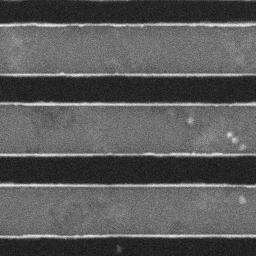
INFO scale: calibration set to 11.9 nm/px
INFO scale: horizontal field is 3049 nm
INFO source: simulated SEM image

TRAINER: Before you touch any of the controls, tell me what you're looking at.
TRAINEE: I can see lines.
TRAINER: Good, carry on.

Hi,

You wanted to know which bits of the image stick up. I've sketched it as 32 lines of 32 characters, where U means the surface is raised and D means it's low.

UUUUUUUUUUUUUUUUUUUUUUUUUUUUUUUU
UUUUUUUUUUUUUUUUUUUUUUUUUUUUUUUU
UUUUUUUUUUUUUUUUUUUUUUUUUUUUUUUU
DDDDDDDDDDDDDDDDDDDDDDDDDDDDDDDD
DDDDDDDDDDDDDDDDDDDDDDDDDDDDDDDD
DDDDDDDDDDDDDDDDDDDDDDDDDDDDDDDD
DDDDDDDDDDDDDDDDDDDDDDDDDDDDDDDD
DDDDDDDDDDDDDDDDDDDDDDDDDDDDDDDD
DDDDDDDDDDDDDDDDDDDDDDDDDDDDDDDD
UUUUUUUUUUUUUUUUUUUUUUUUUUUUUUUU
UUUUUUUUUUUUUUUUUUUUUUUUUUUUUUUU
UUUUUUUUUUUUUUUUUUUUUUUUUUUUUUUU
UUUUUUUUUUUUUUUUUUUUUUUUUUUUUUUU
DDDDDDDDDDDDDDDDDDDDDDDDDDDDDDDD
DDDDDDDDDDDDDDDDDDDDDDDDDDDDDDDD
DDDDDDDDDDDDDDDDDDDDDDDDDDDDDDDD
DDDDDDDDDDDDDDDDDDDDDDDDDDDDDDDD
DDDDDDDDDDDDDDDDDDDDDDDDDDDDDDDD
DDDDDDDDDDDDDDDDDDDDDDDDDDDDDDDD
UUUUUUUUUUUUUUUUUUUUUUUUUUUUUUUU
UUUUUUUUUUUUUUUUUUUUUUUUUUUUUUUU
UUUUUUUUUUUUUUUUUUUUUUUUUUUUUUUU
UUUUUUUUUUUUUUUUUUUUUUUUUUUUUUUU
DDDDDDDDDDDDDDDDDDDDDDDDDDDDDDDD
DDDDDDDDDDDDDDDDDDDDDDDDDDDDDDDD
DDDDDDDDDDDDDDDDDDDDDDDDDDDDDDDD
DDDDDDDDDDDDDDDDDDDDDDDDDDDDDDDD
DDDDDDDDDDDDDDDDDDDDDDDDDDDDDDDD
DDDDDDDDDDDDDDDDDDDDDDDDDDDDDDDD
DDDDUUDDDDDUUUUUUUUUUUUUUUUUUUUU
UUUUUUUUUUUUUUUUUUUUUUUUUUUUUUUU
UUUUUUUUUUUUUUUUUUUUUUUUUUUUUUUU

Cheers